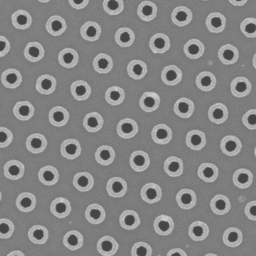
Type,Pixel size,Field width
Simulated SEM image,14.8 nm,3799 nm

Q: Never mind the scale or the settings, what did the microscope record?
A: a regular array of ring-shaped raised bodies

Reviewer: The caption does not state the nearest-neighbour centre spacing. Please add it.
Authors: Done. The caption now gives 507 nm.